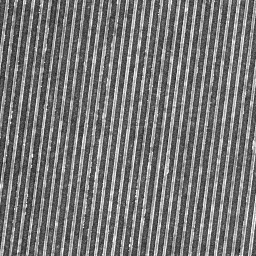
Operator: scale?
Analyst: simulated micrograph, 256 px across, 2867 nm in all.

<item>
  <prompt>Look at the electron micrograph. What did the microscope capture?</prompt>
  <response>parallel lines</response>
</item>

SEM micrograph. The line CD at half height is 29.1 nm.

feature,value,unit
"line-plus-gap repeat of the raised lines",95.1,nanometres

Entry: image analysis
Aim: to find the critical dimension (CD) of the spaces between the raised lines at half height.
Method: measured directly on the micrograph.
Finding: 65.3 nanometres